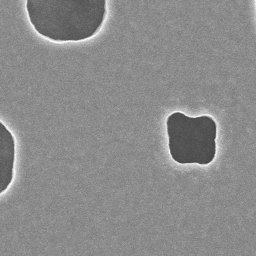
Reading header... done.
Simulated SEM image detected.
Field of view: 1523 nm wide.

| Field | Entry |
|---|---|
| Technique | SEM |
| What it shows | holes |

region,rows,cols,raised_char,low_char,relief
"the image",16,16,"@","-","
@@-----@@@@@@@@@
@@----@@@@@@@@@@
@@@--@@@@@@@@@@@
@@@@@@@@@@@@@@@@
@@@@@@@@@@@@@@@@
@@@@@@@@@@@@@@@@
@@@@@@@@@@@@@@@@
@@@@@@@@@@@--@@@
-@@@@@@@@@@--@@@
-@@@@@@@@@@--@@@
-@@@@@@@@@@@@@@@
-@@@@@@@@@@@@@@@
@@@@@@@@@@@@@@@@
@@@@@@@@@@@@@@@@
@@@@@@@@@@@@@@@@
@@@@@@@@@@@@@@@@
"